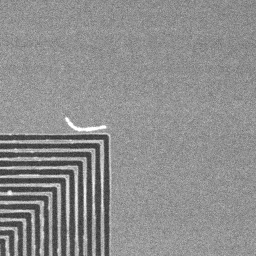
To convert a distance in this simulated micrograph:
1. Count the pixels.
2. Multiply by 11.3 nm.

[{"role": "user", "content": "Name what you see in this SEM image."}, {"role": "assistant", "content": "groups of lines, slits or small figures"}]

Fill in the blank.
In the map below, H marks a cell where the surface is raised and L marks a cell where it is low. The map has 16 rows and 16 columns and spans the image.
HHHHHHHHHHHHHHHH
HHHHHHHHHHHHHHHH
HHHHHHHHHHHHHHHH
HHHHHHHHHHHHHHHH
HHHHHHHHHHHHHHHH
HHHHHHHHHHHHHHHH
HHHHHHHHHHHHHHHH
HHHHHHHHHHHHHHHH
LHHHHHHHHHHHHHHH
LLLLLLLHHHHHHHHH
LLLLLLLHHHHHHHHH
LLLLLLLHHHHHHHHH
LLLLLLLHHHHHHHHH
LLLLLLLHHHHHHHHH
LLLLLLLHHHHHHHHH
LLLLLLLHHHHHHHHH